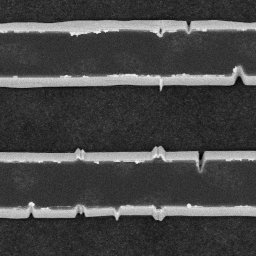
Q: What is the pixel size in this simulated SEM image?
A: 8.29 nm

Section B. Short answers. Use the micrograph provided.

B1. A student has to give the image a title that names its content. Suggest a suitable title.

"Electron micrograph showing one or a few lines or trenches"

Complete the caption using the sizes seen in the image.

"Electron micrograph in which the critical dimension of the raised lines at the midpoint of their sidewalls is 462 nanometres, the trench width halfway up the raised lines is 624 nanometers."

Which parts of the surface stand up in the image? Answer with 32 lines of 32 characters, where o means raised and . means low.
................................
................................
................................
oooooooooooooooooooooooooooooooo
oooooooooooooooooooooooooooooooo
oooooooooooooooooooooooooooooooo
oooooooooooooooooooooooooooooooo
oooooooooooooooooooooooooooooooo
oooooooooooooooooooooooooooooooo
ooooooooooooooooooooooooooooo.oo
................................
................................
................................
................................
................................
................................
................................
................................
................................
.........oo........oo.....oooooo
oooooooooooooooooooooooooooooooo
oooooooooooooooooooooooooooooooo
oooooooooooooooooooooooooooooooo
oooooooooooooooooooooooooooooooo
oooooooooooooooooooooooooooooooo
oooooooooooooooooooooooooooooooo
ooooooooooooooo....oo..........o
................................
................................
................................
................................
................................